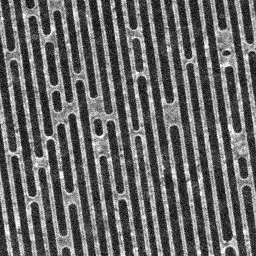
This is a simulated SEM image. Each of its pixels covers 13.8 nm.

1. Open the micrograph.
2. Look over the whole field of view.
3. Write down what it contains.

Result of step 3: parallel lines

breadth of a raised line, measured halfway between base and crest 49.4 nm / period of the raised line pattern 171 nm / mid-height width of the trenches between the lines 126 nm